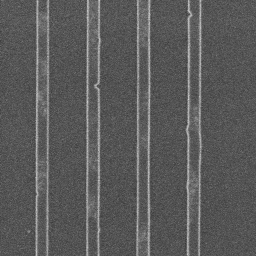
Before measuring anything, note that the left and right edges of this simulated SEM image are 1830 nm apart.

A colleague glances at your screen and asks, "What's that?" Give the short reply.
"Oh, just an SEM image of parallel lines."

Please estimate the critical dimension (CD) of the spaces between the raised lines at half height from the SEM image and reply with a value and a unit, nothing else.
279 nm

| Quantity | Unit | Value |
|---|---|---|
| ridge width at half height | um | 0.0822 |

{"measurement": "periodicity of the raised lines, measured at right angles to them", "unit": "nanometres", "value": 362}